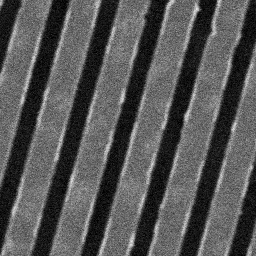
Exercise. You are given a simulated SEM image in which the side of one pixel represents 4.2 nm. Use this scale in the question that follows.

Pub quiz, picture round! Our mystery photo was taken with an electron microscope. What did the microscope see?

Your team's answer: parallel lines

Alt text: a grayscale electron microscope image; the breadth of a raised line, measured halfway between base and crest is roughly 125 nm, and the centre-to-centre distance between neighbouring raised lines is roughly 47.5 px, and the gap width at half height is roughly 73.3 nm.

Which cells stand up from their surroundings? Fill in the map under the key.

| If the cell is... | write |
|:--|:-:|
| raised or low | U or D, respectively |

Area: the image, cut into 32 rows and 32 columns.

DDDUUUDDDUUUUDDUUUUDDUUUUDDUUUUD
DDUUUUDDUUUUDDDUUUDDDUUUUDDUUUUD
DDUUUUDDUUUUDDUUUUDDUUUUDDDUUUUD
DDUUUUDDUUUUDDUUUUDDUUUUDDUUUUDD
DUUUUDDDUUUDDDUUUUDDUUUUDDUUUUDD
DUUUUDDUUUUDDUUUUDDDUUUDDDUUUUDD
DUUUUDDUUUUDDUUUUDDUUUUDDUUUUDDD
DUUUDDDUUUUDDUUUUDDUUUUDDUUUUDDU
UUUUDDUUUUDDDUUUUDDUUUUDDUUUUDDU
UUUUDDUUUUDDUUUUDDUUUUDDDUUUUDDU
UUUUDDUUUUDDUUUUDDUUUUDDUUUUDDDU
UUUDDDUUUUDDUUUUDDUUUUDDUUUUDDUU
UUUDDUUUUDDDUUUDDDUUUUDDUUUUDDUU
UUUDDUUUUDDUUUUDDUUUUDDDUUUDDDUU
UUDDDUUUUDDUUUUDDUUUUDDUUUUDDUUU
UUDDDUUUDDDUUUUDDUUUUDDUUUUDDUUU
UUDDUUUUDDUUUUDDDUUUDDDUUUUDDUUU
UUDDUUUUDDUUUUDDUUUUDDUUUUDDDUUU
UDDDUUUUDDUUUUDDUUUUDDUUUUDDUUUU
UDDUUUUDDDUUUDDDUUUUDDUUUUDDUUUU
UDDUUUUDDUUUUDDUUUUDDDUUUUDDUUUU
UDDUUUUDDUUUUDDUUUUDDUUUUDDDUUUD
DDDUUUDDDUUUUDDUUUUDDUUUUDDUUUUD
DDUUUUDDDUUUDDDUUUUDDUUUUDDUUUUD
DDUUUUDDUUUUDDUUUUDDDUUUDDDUUUUD
DDUUUUDDUUUUDDUUUUDDUUUUDDUUUUDD
DUUUUDDDUUUUDDUUUUDDUUUUDDUUUUDD
DUUUUDDUUUUDDDUUUDDDUUUUDDUUUUDD
DUUUUDDUUUUDDUUUUDDUUUUDDDUUUDDD
DUUUUDDUUUUDDUUUUDDUUUUDDUUUUDDD
UUUUDDDUUUDDDUUUUDDUUUUDDUUUUDDU
UUUUDDUUUUDDUUUUDDDUUUDDDUUUUDDU